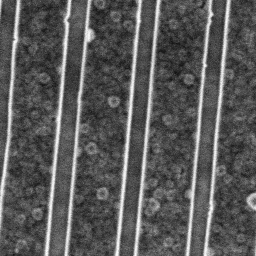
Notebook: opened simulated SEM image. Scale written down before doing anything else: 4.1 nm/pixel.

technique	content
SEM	one or a few lines or trenches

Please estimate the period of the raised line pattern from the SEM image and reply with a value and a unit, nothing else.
286 nm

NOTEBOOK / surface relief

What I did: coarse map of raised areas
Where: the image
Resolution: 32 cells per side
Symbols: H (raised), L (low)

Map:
LLHHHHHHHLLHHHHHHHLLHHHHHHLLHHHH
LLHHHHHHHLLHHHHHHLLLHHHHHHLLHHHH
LLHHHHHHLLLHHHHHHLLLHHHHHHLLHHHH
LLHHHHHHLLLHHHHHHLLHHHHHHHLLHHHH
LLHHHHHHLLLHHHHHHLLHHHHHHHLLHHHH
LLHHHHHHLLLHHHHHHLLHHHHHHHLLHHHH
LLHHHHHHLLHHHHHHHLLHHHHHHHLLHHHH
LLHHHHHHLLHHHHHHHLLHHHHHHHLLHHHH
LLHHHHHHLLHHHHHHHLLHHHHHHHLLHHHH
LLHHHHHHLLHHHHHHHLLHHHHHHLLLHHHH
LHHHHHHHLLHHHHHHHLLHHHHHHLLLHHHH
LHHHHHHHLLHHHHHHHLLHHHHHHLLLHHHH
LHHHHHHHLLHHHHHHLLLHHHHHHLLHHHHH
LHHHHHHHLLHHHHHHLLLHHHHHHLLHHHHH
LHHHHHHLLLHHHHHHLLHHHHHHHLLHHHHH
LHHHHHHLLLHHHHHHLLHHHHHHHLLHHHHH
LHHHHHHLLLHHHHHHLLHHHHHHHLLHHHHH
LHHHHHHLLHHHHHHHLLHHHHHHHLLHHHHH
LHHHHHHLLHHHHHHHLLHHHHHHHLLHHHHH
LHHHHHHLLHHHHHHHLLHHHHHHHLLHHHHH
LHHHHHHLLHHHHHHHLLHHHHHHLLLHHHHH
LHHHHHHLLHHHHHHHLLHHHHHHLLLHHHHH
HHHHHHHLLHHHHHHHLLHHHHHHLLLHHHHH
HHHHHHHLLHHHHHHLLLHHHHHHLLHHHHHH
HHHHHHHLLHHHHHHLLLHHHHHHLLHHHHHH
HHHHHHLLLHHHHHHLLHHHHHHHLLHHHHHH
HHHHHHLLLHHHHHHLLHHHHHHHLLHHHHHH
HHHHHHLLLHHHHHHLLHHHHHHHLLHHHHHH
HHHHHHLLHHHHHHHLLHHHHHHHLLHHHHHH
HHHHHHLLHHHHHHHLLHHHHHHHLLHHHHHH
HHHHHHLLHHHHHHHLLHHHHHHHLLHHHHHH
HHHHHHLLHHHHHHHLLHHHHHHHLLHHHHHH